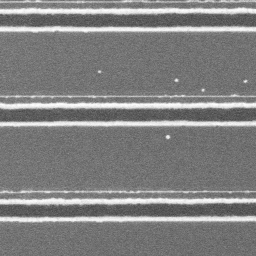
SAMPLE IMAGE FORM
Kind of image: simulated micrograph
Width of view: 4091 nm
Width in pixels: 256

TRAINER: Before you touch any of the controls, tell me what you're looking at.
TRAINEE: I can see lines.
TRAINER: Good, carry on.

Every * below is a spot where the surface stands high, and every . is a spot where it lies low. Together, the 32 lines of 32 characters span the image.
********************************
................................
................................
................................
********************************
********************************
********************************
********************************
********************************
********************************
********************************
********************************
********************************
................................
................................
........***...**....****..**...*
********************************
********************************
********************************
********************************
********************************
********************************
********************************
********************************
********************************
................................
................................
...............*.**..........***
********************************
********************************
********************************
********************************